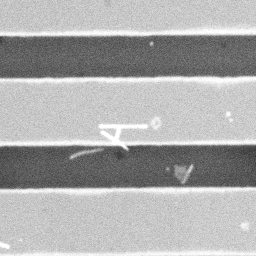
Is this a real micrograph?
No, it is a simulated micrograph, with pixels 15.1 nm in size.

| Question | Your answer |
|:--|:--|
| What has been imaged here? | lines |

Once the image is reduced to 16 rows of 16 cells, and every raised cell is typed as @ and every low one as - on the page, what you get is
@@@@@@@@@@@@@@@@
@@@@@@@@@@@@@@@@
----------------
----------------
----------------
@@@@@@@@@@@@@@@@
@@@@@@@@@@@@@@@@
@@@@@@@@@@@@@@@@
@@@@@@@@@@@@@@@@
----------------
----------------
----------------
@@@@@@@@@@@@@@@@
@@@@@@@@@@@@@@@@
@@@@@@@@@@@@@@@@
@@@@@@@@@@@@@@@@